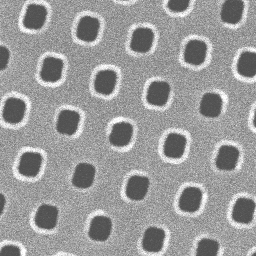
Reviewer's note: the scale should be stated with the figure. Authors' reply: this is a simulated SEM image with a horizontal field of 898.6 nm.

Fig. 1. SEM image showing a regular array of holes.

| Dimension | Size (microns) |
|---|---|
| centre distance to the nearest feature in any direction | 0.192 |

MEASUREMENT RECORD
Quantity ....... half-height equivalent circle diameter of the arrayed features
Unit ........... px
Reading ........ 24.3